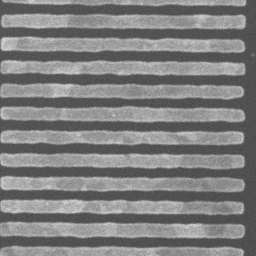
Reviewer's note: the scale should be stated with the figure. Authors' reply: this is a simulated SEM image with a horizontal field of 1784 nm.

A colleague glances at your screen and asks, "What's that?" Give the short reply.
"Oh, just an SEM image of wiring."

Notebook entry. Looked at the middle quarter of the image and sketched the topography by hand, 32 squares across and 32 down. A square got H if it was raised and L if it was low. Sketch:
HHHHHHHHHHHHHHHHHHHHHHHHHHHHHHHH
HHHHHHHHHHHHHHHHHHHHHHHHHHHHHHHH
LLLLLLLLLLLLLLHHLLLLLLLHHLLLLLHH
LLLLLLLLLLLLLLLLLLLLLLLLLLLLLLLL
LLLLLLLLLLLLLLLLLLLLLLLLLLLLLLLL
HHHHLLLHHHHHHLHHHHHLLLLLLLLLLLLL
HHHHHHHHHHHHHHHHHHHHHHHHHHHHHHHH
HHHHHHHHHHHHHHHHHHHHHHHHHHHHHHHH
LLLLLLLLLLLLLLLLLLLLLLLLLLLLLLLL
LLLLLLLLLLLLLLLLLLLLLLLLLLLLLLLL
LLLLLLLLLLLLLLLLLLLLLLLLLLLLLLLL
HHHHHHHHHHHHHHHHHHHHHHHHHHHHHHHH
HHHHHHHHHHHHHHHHHHHHHHHHHHHHHHHH
HHHHHHHHHHHHHHHHHHHHHHHHHHHHHHHH
LLLLLLLLLLLLLLLLLLLLLLLLLLLLLLLL
LLLLLLLLLLLLLLLLLLLLLLLLLLLLLLLL
LLLLLLLLLLLLLLLLLLLLLLLLLLLLLLLL
HHHHHHHHHHHHHHHHHHHHHHHHHHHHHHHH
HHHHHHHHHHHHHHHHHHHHHHHHHHHHHHHH
HHLLLLHHHHHHHHHHHHHHHHHHHHHHHHHH
LLLLLLLLLLLLLLLLLLLLLLLLLLLLLLLL
LLLLLLLLLLLLLLLLLLLLLLLLLLLLLLLL
LLLLLLLLLLLLLLLLLLLLLLLLLLLLLLLL
HHHHHHHHHHHHHHHHHHHHHHHHHHHHHHHH
HHHHHHHHHHHHHHHHHHHHHHHHHHHHHHHH
LLLLLLLLHHHHHLLLLLHHHHHHHHHHLLHH
LLLLLLLLLLLLLLLLLLLLLLLLLLLLLLLL
LLLLLLLLLLLLLLLLLLLLLLLLLLLLLLLL
HHHHLLLLLLLLLLLLLLLLLLLLLLLLLLLL
HHHHHHHHHHHHHHHHHHHHHHHHHHHHHHHH
HHHHHHHHHHHHHHHHHHHHHHHHHHHHHHHH
LLLLLLLLLLLLLLLLLLLLLLLLLLLLLLLL